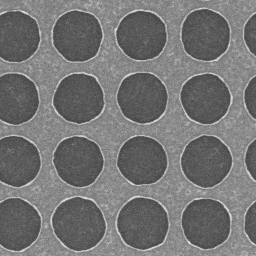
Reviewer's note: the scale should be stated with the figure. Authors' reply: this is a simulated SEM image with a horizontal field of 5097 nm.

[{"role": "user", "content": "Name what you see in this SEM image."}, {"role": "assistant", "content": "a regular array of holes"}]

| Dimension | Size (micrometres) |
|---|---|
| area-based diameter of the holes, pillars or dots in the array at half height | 1.02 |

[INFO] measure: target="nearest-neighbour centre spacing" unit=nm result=1250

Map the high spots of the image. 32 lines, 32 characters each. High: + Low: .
++++++++++++++++++++++++++++++++
+..++++++.+++++++..+++++...+++++
....+++.....+++.....+++.....+++.
.....++......++......++......++.
.....+.......++......++......+..
.....++......++......++......++.
....+++.....+++.....+++.....+++.
+..+++++...++++++.+++++++..+++++
++++++++++++++++++++++++++++++++
...+++++...+++++...+++++...+++++
....+++.....+++.....+++.....+++.
.....++......++......++......++.
.....++......++......++......++.
.....++......++......++......++.
....++++....++++....+++.....+++.
+.++++++++++++++++++++++++++++++
++++++++++++++++++++++++++++++++
...+++++...+++++...+++++....++++
.....++.....+++.....+++.....+++.
.....++......++......++......++.
.....++......++......++......++.
.....++......++......++......++.
....++++....++++....++++....++++
++++++++++++++++++++++++++++++++
++++++++++++++++++++++++++++++++
....++++....++++....++++....++++
.....++......++......++......++.
.....+.......++......++......++.
.....++......++......++......++.
.....++......++......++......++.
....++++....++++....++++....++++
++++++++++++++++++++++++++++++++